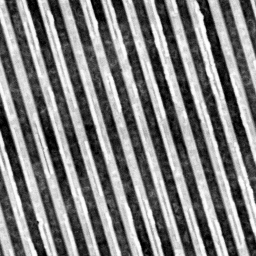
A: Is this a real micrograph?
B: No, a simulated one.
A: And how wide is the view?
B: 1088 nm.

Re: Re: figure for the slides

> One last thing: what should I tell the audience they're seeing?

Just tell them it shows parallel lines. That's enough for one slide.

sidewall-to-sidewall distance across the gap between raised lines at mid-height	46.9	nanometers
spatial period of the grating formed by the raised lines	86.9	nm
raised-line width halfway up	39.3	nanometers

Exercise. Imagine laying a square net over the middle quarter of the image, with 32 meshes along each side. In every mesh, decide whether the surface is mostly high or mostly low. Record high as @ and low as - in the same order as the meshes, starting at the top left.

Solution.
@--@@@---@@---@@@--@@@---@@---@@
@---@@---@@----@@---@@---@@---@@
@---@@---@@@---@@---@@---@@@---@
@---@@@---@@---@@---@@@--@@@---@
@@---@@---@@---@@----@@---@@---@
@@---@@---@@@---@@---@@---@@@--@
@@---@@@--@@@---@@---@@@--@@@---
@@@--@@@---@@---@@----@@---@@---
-@@---@@---@@@--@@@---@@---@@---
-@@---@@---@@@---@@---@@---@@@--
-@@---@@@---@@---@@---@@@---@@--
-@@@---@@---@@---@@@---@@---@@--
--@@---@@---@@@---@@---@@---@@@-
--@@---@@@--@@@---@@---@@@---@@-
--@@@---@@---@@---@@@---@@---@@-
---@@---@@---@@---@@@---@@---@@-
---@@---@@---@@@---@@---@@---@@@
---@@@--@@@---@@---@@---@@@---@@
---@@@---@@---@@---@@@---@@---@@
@---@@---@@---@@@--@@@---@@---@@
@---@@---@@@---@@---@@---@@@---@
@---@@@---@@---@@---@@@---@@---@
@---@@@---@@---@@----@@---@@---@
@@---@@---@@@--@@@---@@---@@@--@
@@---@@@--@@@---@@---@@---@@@---
@@---@@@---@@---@@---@@@---@@---
@@@---@@---@@---@@@---@@---@@---
-@@---@@---@@@---@@---@@---@@@--
-@@---@@@---@@---@@---@@@---@@--
-@@----@@---@@---@@@---@@---@@--
-@@@---@@---@@@--@@@---@@---@@@-
--@@---@@@--@@@---@@---@@---@@@-